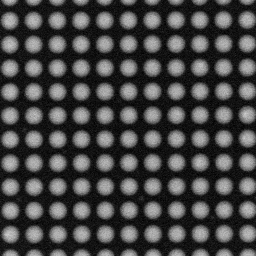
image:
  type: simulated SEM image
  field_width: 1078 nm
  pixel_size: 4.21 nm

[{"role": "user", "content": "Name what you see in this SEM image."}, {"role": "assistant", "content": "an array of small figures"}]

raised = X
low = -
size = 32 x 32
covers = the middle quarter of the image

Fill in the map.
--XXXX--XXXX--XXXX--XXXX--XXXX--
--XXXX--XXXX--XXXX--XXXX--XXXX--
---XXX---XXX---XXX---XX----XX---
--------------------------------
--------------------------------
---XXX---XXX--XXXX--XXXX--XXXX--
--XXXX--XXXX--XXXX--XXXX--XXXX--
--XXXX--XXXX--XXXX--XXXX--XXXX--
---XXX---XXX---XXX---XXX---XX---
--------------------------------
--------------------------------
---XXX---XXX---XXX--XXXX--XXXX--
--XXXX--XXXX--XXXX--XXXX--XXXX--
--XXXX--XXXX--XXXX--XXXX--XXXX--
---XXX---XXX---XXX---XX----XX---
--------------------------------
--------------------------------
---XXX---XXX---XXX--XXXX--XXXX--
--XXXX--XXXX--XXXX--XXXX--XXXX--
--XXXX--XXXX--XXXX--XXXX--XXXX--
---XXX---XXX---XX----XX----XX---
--------------------------------
--------------------------------
---XXX---XXX--XXXX--XXXX--XXXX--
X-XXXX--XXXX--XXXX--XXXX--XXXX--
--XXXX--XXXX--XXXX--XXXX--XXXX--
---XXX---XXX---XX----XX----XX---
--------------------------------
--------------------------------
---XXX---XXX---XXX--XXXX--XXXX--
X-XXXX--XXXX--XXXX--XXXX--XXXX--
--XXXX--XXXX--XXXX--XXXX--XXXX--